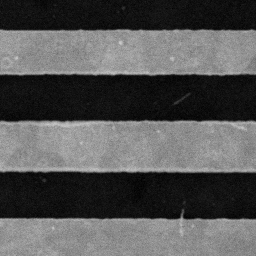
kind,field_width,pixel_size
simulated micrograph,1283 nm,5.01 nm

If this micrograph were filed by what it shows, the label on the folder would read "lines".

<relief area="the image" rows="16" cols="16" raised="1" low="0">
0000000000000000
0000000000000000
1111111111111111
1111111111111111
1111111111111111
0000000000000000
0000000000000000
0000000000000000
1111111111111111
1111111111111111
1111111111111111
0000000000000000
0000000000000000
0000000000000000
1111111111111111
1111111111111111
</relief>